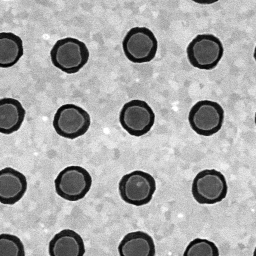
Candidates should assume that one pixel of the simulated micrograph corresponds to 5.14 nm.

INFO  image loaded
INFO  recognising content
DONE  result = a regular array of ring-shaped grooves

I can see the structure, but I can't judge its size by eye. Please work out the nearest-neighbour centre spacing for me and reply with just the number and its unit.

63.4 pixels